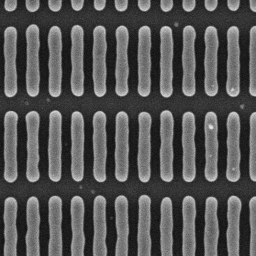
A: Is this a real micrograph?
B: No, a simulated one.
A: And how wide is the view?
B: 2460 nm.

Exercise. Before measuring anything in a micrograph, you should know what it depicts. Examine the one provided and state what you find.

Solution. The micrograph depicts groups of lines, slits or small figures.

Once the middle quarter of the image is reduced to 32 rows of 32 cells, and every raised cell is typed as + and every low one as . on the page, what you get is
..+++..+++...+++...++...+++...++
..+++..+++...+++...++...+++...++
..+++..+++...+++...++...+++...++
..+++..+++...+++...++...+++...++
..+++...++...+++...++...+++...++
..+++...++...+++...++...+++...++
..+++...++...+++...++...+++...++
...++...++...++....++...+++...++
................................
................................
................................
................................
..++....++....+....++...+++...++
..+++..+++...+++...+++..+++...++
..+++..+++...+++...+++..+++...++
..+++..+++...+++...++...+++...++
..+++...++...+++...++...+++...++
..+++..+++...+++...++...+++...++
..+++..+++...+++...++...+++...++
..+++..+++...+++...++...+++...++
..+++..+++...+++...++...+++...++
..+++...++...+++...++...+++...++
..+++...++...+++...++...+++...++
..+++...++...+++...++...+++...++
..+++...++...+++...++...+++...++
..+++...++...+++...++...+++...++
..+++...++...+++...++...+++...++
..+++...++...+++...++...+++...++
..+++...++...+++...++...+++...++
................................
................................
................................